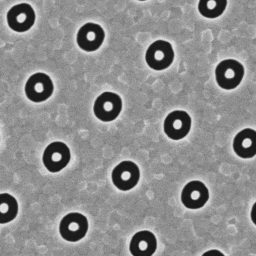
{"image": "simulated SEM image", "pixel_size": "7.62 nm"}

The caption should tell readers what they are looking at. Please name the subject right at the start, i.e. a regular array of ring-shaped grooves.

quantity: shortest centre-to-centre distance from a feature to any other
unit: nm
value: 546